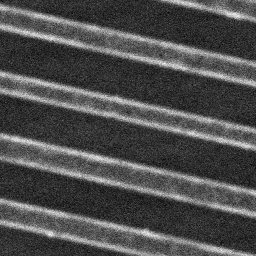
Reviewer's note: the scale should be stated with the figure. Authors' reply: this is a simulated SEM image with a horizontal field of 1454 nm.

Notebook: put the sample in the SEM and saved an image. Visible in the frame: one or a few lines or trenches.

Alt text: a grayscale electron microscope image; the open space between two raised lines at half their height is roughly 240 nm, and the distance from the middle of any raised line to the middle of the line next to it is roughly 63.2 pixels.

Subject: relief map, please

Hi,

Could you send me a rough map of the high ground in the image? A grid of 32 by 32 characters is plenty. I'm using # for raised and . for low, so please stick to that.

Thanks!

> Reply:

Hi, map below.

.......................#########
###........................#####
########........................
############....................
.....############...............
.........############...........
..............###########.......
..................############..
......................##########
##.........................#####
######.........................#
###########.....................
.....##########.................
.........###########............
..............##########........
..................##########....
.......................#########
###........................#####
#######........................#
############....................
...#############................
........#############...........
............#############.......
................##############..
.....................###########
##.......................#######
#######.......................##
###########.....................
...############.................
........############............
............############........
................#############...